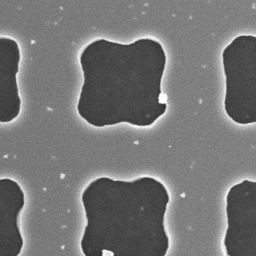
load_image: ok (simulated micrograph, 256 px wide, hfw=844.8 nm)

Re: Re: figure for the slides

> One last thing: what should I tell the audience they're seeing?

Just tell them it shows holes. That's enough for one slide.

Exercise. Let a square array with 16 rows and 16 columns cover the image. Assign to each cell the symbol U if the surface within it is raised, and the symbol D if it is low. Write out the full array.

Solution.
UUUUUUUUUUUUUUUU
UUUUUUUUUUUUUUUU
DUUUUUUUUUUUUUUD
DUUUUDDDDDUUUUDD
DUUUUDDDDDUUUUDD
DUUUUDDDDDUUUUDD
DUUUUDDDDDUUUUDD
DUUUUDDDDDUUUUUD
UUUUUUUUUUUUUUUU
UUUUUUUUUUUUUUUU
UUUUUUUUUUUUUUUU
DUUUUUDDDDUUUUUD
DUUUUDDDDDUUUUDD
DUUUUDDDDDUUUUDD
DUUUUDDDDDUUUUDD
DUUUUDDDDDUUUUDD